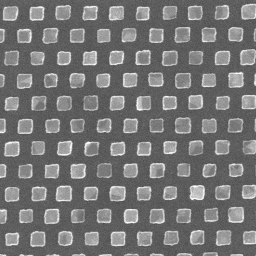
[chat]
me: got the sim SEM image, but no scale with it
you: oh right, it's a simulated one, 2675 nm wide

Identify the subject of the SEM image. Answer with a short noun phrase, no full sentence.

a regular array of raised bodies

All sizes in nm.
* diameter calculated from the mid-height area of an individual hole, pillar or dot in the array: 157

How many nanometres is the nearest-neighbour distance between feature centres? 266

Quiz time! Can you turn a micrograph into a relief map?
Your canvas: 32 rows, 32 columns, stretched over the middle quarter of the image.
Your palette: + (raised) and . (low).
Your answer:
................................
................................
..++...........+++...+++....+++.
..+++...+++....+++...++++...++++
.++++...+++....+++...++++...++++
..+++....++....++...........+++.
................................
................................
++...+++....+++....+++...+++...+
++...+++....+++...++++...+++...+
++...+++....+++...++++...+++...+
+.....++........................
................................
................................
..+++....+++...+++...++++...+++.
..+++...++++...+++...++++...++++
..+++...++++...+++....+++...+++.
................................
................................
++.........................+....
++...+++....+++....+++...+++...+
++...+++....+++....+++...+++...+
+....+++....+++...+++..........+
................................
................................
..+++....+++...+++....+++....++.
..+++....+++...+++....+++....++.
..+++...++++...+++....+++....++.
................................
................................
................................
++...+++....+++...++++...+++....